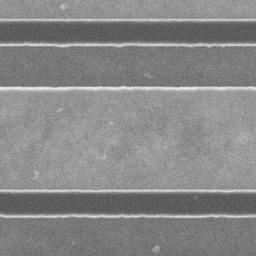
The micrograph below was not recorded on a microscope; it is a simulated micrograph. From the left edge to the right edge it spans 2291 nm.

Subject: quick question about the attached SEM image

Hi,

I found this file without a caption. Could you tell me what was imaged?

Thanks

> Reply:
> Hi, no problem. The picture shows lines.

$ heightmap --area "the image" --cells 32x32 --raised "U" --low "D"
UUUUUUUUUUUUUUUUUUUUUUUUUUUUUUUU
UUUUUUUUUUUUUUUUUUUUUUUUUUUUUUUU
UUUUUUUUUUUUUUUUUUUUUUUUUUUUUUUU
UUUUUUUUUUUUUUUUUUUUUUUUUUUUUUUU
UUUUUUUUUUUUUUUUUUUUUUUUUUUUUUUU
UUUUUUUUUUUUUUUUUUUUUUUUUUUUUUUU
DDDDDDDDDDDDDDDDDDDDDDDDDDDDDDDD
DDDDDDDDDDDDDDDDDDDDDDDDDDDDDDDD
DDDDDDDDDDDDDDDDDDDDDDDDDDDDDDDD
DDDDDDDDDDDDDDDDDDDDDDDDDDDDDDDD
DDDDDDDDDDDDDDDDDDDDDDDDDDDDDDDD
UUUUUUUUUUUUUUUUUUUUUUUUUUUUUUUU
UUUUUUUUUUUUUUUUUUUUUUUUUUUUUUUU
UUUUUUUUUUUUUUUUUUUUUUUUUUUUUUUU
UUUUUUUUUUUUUUUUUUUUUUUUUUUUUUUU
UUUUUUUUUUUUUUUUUUUUUUUUUUUUUUUU
UUUUUUUUUUUUUUUUUUUUUUUUUUUUUUUU
UUUUUUUUUUUUUUUUUUUUUUUUUUUUUUUU
UUUUUUUUUUUUUUUUUUUUUUUUUUUUUUUU
UUUUUUUUUUUUUUUUUUUUUUUUUUUUUUUU
UUUUUUUUUUUUUUUUUUUUUUUUUUUUUUUU
UUUUUUUUUUUUUUUUUUUUUUUUUUUUUUUU
UUUUUUUUUUUUUUUUUUUUUUUUUUUUUUUU
UUUUUUUUUUUUUUUUUUUUUUUUUUUUUUUU
UUUUUUUUUUUUUUUUUUUUUUUUUUUUUUUU
UUUUUUUUUUUUUUUUUUUUUUUUUUUUUUUU
UUUUUUUUUUUUUUUUUUUUUUUUUUUUUUUU
DDDDDDDDDDDDDDDDDDDDDDDDDDDDDDDD
DDDDDDDDDDDDDDDDDDDDDDDDDDDDDDDD
DDDDDDDDDDDDDDDDDDDDDDDDDDDDDDDD
DDDDDDDDDDDDDDDDDDDDDDDDDDDDDDDD
DDDDDDDDDDDDDDDDDDDDDDDDDDDDDDDD